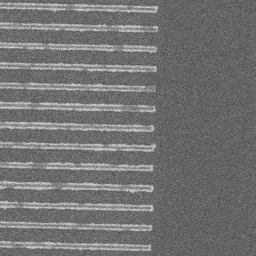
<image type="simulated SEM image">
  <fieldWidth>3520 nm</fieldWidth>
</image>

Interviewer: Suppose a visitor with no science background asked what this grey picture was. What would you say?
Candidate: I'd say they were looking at parallel lines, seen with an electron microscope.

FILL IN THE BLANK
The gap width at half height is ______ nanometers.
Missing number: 187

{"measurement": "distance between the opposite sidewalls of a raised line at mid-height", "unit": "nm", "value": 80.7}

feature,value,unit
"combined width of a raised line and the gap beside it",273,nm